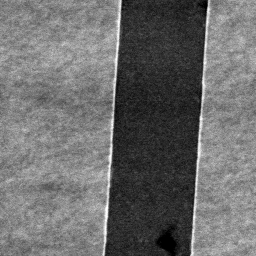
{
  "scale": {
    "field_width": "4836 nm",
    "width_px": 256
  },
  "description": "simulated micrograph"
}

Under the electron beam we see one or a few lines or trenches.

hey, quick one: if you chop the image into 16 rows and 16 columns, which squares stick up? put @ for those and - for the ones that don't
@@@@@@@@-----@@@
@@@@@@@------@@@
@@@@@@@------@@@
@@@@@@@------@@@
@@@@@@@------@@@
@@@@@@@------@@@
@@@@@@@------@@@
@@@@@@@------@@@
@@@@@@@-----@@@@
@@@@@@@-----@@@@
@@@@@@@-----@@@@
@@@@@@@-----@@@@
@@@@@@@-----@@@@
@@@@@@@-----@@@@
@@@@@@@-----@@@@
@@@@@@@-----@@@@